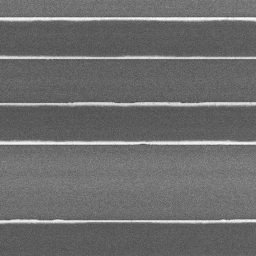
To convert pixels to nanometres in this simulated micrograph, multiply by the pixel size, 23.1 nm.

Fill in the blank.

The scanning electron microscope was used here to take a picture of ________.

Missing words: lines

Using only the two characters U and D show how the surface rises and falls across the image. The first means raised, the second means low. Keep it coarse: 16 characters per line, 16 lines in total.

DDDDDDDDDDDDDDDD
UUUUUUUUUUUUUUUU
UUUUUUUUUUUUUUUU
UUUUUUUUUUUUUUUU
DDDDDDDDDDDDDDDD
DDDDDDDDDDDDDDDD
UUUUUUUUUUUUUUUU
UUUUUUUUUUUUUUUU
UUUUUUUUUUUUUUUU
DDDDDDDDDDDDDDDD
DDDDDDDDDDDDDDDD
DDDDDDDDDDDDDDDD
DDDDDDDDDDDDDDDD
DDDDDDDDDDDDDDDD
UUUUUUUUUUUUUUUU
UUUUUUUUUUUUUUUU